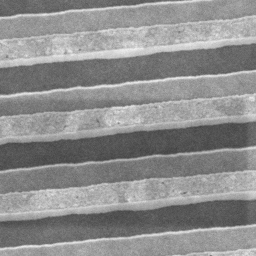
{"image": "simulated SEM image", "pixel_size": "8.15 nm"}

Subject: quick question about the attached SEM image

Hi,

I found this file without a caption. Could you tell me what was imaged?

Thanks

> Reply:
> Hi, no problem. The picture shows lines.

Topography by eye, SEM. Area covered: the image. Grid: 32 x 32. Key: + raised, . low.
...................+++++++++++++
........++++++++++++++++++++++++
++++++++++++++++++++++++++++++++
++++++++++++++++++++++++++++++++
++++++++++++++++++++++++++++++++
+++++++++++++++++++++++++.......
+++++++++++++++.................
++++............................
................................
..........................++++++
...............+++++++++++++++++
......++++++++++++++++++++++++++
++++++++++++++++++++++++++++++++
++++++++++++++++++++++++++++++++
++++++++++++++++++++++++++++++++
+++++++++++++++++++++++.........
+++++++++++.....................
................................
...............................+
...................+++++++++++++
..........++++++++++++++++++++++
++++++++++++++++++++++++++++++++
++++++++++++++++++++++++++++++++
++++++++++++++++++++++++++++++++
+++++++++++++++++++++++++++.....
++++++++++++++++++..............
++++++..........................
................................
............................++++
.................+++++++++++++++
.......+++++++++++++++++++++++++
++++++++++++++++++++++++++++++++